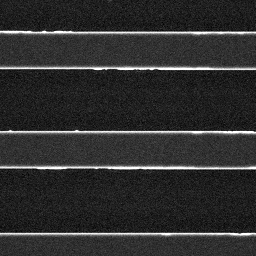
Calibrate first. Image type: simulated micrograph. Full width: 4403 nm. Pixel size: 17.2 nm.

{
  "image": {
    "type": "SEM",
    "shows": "lines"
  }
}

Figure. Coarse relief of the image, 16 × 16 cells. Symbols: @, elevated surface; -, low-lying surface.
----------------
----------------
@@@@@@@@@@@@@@@@
@@@@@@@@@@@@@@@@
----------------
----------------
----------------
----------------
@@@@@@@@@@@@@@@@
@@@@@@@@@@@@@@@@
--@@@-@@@@@@@@@@
----------------
----------------
----------------
----------------
@@@@@@@@@@@@@@@@